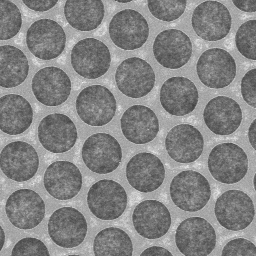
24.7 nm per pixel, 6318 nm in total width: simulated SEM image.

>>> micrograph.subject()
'a regular array of holes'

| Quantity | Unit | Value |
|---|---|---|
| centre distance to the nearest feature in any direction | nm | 1170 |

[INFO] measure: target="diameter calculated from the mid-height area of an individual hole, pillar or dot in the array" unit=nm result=1000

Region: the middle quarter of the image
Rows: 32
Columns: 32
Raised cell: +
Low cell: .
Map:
++.........++.........+++.....++
+++........++.........++++++++++
.+++......+++..........+++++++++
.++++...+++++..........++++....+
..+++++++++++..........++.......
..++++....+++.........++........
..++.......+++........++........
..++........+++......+++........
.++..........++++..+++++........
+++..........+++++++++++........
+++..........++++...+++++.......
+++..........++.......+++.......
+++..........++........+++.....+
.+++........++.........+++++++++
..+++......+++..........++++++++
...++++..+++++..........++++....
...+++++++++++..........++......
...++++....++++........+++......
...+++.......++........++.......
...++.........+++....++++.......
..+++.........+++++++++++.......
..++..........+++++++++++.......
++++...........+++....++++......
+++++.........+++.......+++.....
..+++.........++.........+++....
...+++........++.........+++++++
....+++......++..........++++++.
....+++++..++++..........+++....
.....+++++++++++.........++.....
.....+++.....+++.........++.....
....+++........++.......++......
....++.........+++.....+++......